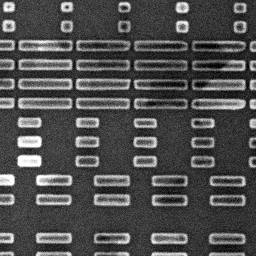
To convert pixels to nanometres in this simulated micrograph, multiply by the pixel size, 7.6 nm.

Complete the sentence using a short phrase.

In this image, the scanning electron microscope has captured wiring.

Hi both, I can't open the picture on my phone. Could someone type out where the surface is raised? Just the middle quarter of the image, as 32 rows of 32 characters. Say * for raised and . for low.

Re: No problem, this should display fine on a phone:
**.*************..*************.
................................
................................
................................
**.*************..*************.
**.*************..*************.
................................
................................
................................
**.*************..*************.
**.*************..*************.
................................
................................
................................
...*****..........*****.........
....****..........*****.........
................................
................................
...*****........................
...*****..........*****.........
...*****..........*****.........
................................
................................
...*****..........*****.........
...*****..........*****.........
................................
................................
................................
**......********......*********.
**......********......*********.
................................
................................